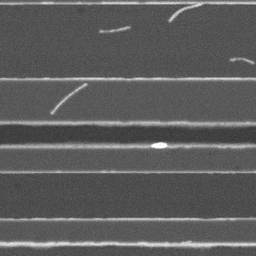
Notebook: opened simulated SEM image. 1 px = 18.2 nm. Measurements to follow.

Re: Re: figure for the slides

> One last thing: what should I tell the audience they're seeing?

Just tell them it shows lines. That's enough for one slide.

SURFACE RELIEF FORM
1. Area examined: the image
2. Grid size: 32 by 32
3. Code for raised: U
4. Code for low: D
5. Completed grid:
DDDDDDDDDDDDDDDDDDDDDDDDUDDDDDDD
DDDDDDDDDDDDDDDDDDDDDDDDDDDDDDDD
DDDDDDDDDDDDDDDDDDDDDDDDDDDDDDDD
DDDDDDDDDDDDDDDDDDDDDDDDDDDDDDDD
DDDDDDDDDDDDDDDDDDDDDDDDDDDDDDDD
DDDDDDDDDDDDDDDDDDDDDDDDDDDDDDDD
DDDDDDDDDDDDDDDDDDDDDDDDDDDDDDDD
DDDDDDDDDDDDDDDDDDDDDDDDDDDDDDDD
DDDDDDDDDDDDDDDDDDDDDDDDDDDDDDDD
DDDDDDDDDDDDDDDDDDDDDDDDDDDDDDDD
UUUUUUUUUUUUUUUUUUUUUUUUUUUUUUUU
UUUUUUUUUUUUUUUUUUUUUUUUUUUUUUUU
UUUUUUUUUUUUUUUUUUUUUUUUUUUUUUUU
UUUUUUUUUUUUUUUUUUUUUUUUUUUUUUUU
UUUUUUUUUUUUUUUUUUUUUUUUUUUUUUUU
DDDDDDDDDDDDDDDDDDDDDDDDDDDDDDDD
DDDDDDDDDDDDDDDDDDDDDDDDDDDDDDDD
DDDDDDDDDDDDDDDDDDDDDDDDDDDDDDDD
UUUUUUUUUUUUUUUUUUUUUUUUUUUUUUUU
UUUUUUUUUUUUUUUUUUUUUUUUUUUUUUUU
UUUUUUUUUUUUUUUUUUUUUUUUUUUUUUUU
UUUUUUUUUUUUUUUUUUUUUUUUUUUUUUUU
DDDDDDDDDDDDDDDDDDDDDDDDDDDDDDDD
DDDDDDDDDDDDDDDDDDDDDDDDDDDDDDDD
DDDDDDDDDDDDDDDDDDDDDDDDDDDDDDDD
DDDDDDDDDDDDDDDDDDDDDDDDDDDDDDDD
DDDDDDDDDDDDDDDDDDDDDDDDDDDDDDDD
UUUUUUUUUUUUUUUUUUUUUUUUUUUUUUUU
UUUUUUUUUUUUUUUUUUUUUUUUUUUUUUUU
UUUUUUUUUUUUUUUUUUUUUUUUUUUUUUUU
DDDDDDDDDDDDDDDDDDDDDUUDDUUDDDDD
DDDDDDDDDDDDDDDDDDDDDDDDDDDDDDDD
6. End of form